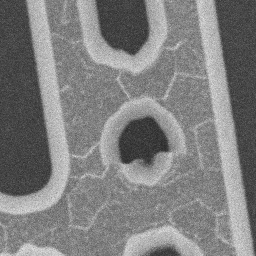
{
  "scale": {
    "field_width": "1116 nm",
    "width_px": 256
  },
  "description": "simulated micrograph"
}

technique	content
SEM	one or a few lines or trenches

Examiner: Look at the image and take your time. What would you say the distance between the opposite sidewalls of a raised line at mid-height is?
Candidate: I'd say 0.228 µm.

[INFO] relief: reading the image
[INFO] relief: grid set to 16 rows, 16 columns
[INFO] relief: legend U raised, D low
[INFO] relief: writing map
DDUUUDDDDDUUUDDD
DDDUUUDDDDUUUDDD
DDDUUUDDDDUUUDDD
DDDUUUUDDUUUUDDD
DDDUUUUUUUUUUDDD
DDDUUUUUUUUUUUDD
DDDUUUUUUUUUUUDD
DDDUUUUDDDUUUUDD
DDDDUUUDDDDUUUDD
DDDDUUUDDDDUUUDD
DDDDUUUUDDUUUUDD
DDDDUUUUUUUUUUUD
DDDUUUUUUUUUUUUD
UUUUUUUUUUUUUUUD
UUUUUUUUUUUUUUUD
UUUUUUUUDDDDUUUD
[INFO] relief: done